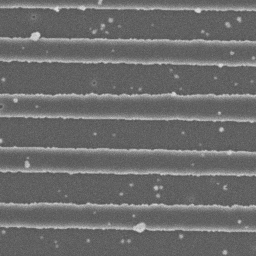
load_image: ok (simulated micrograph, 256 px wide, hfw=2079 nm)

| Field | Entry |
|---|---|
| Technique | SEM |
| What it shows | lines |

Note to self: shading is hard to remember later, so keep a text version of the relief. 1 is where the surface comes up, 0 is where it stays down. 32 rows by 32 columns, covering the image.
11111111111111111111111111111111
00000000000000000000000000000000
00000000000000000000000000000000
00000000000000000000000000000000
00001000000000000000000000000000
11111111111111111111111111111111
11111111111111111111111111111111
11111111111111111111111111111111
00000000000000000000000000000000
00000000000000000000000000000000
00000000000000000000000000000000
00000000000000000000000000000000
11111111111111111111111111111111
11111111111111111111111111111111
11111111111111111111111111111111
00000000000000000000000000000000
00000000000000000000000000000000
00000000000000000000000000000000
11111111000000000000000000000000
11111111111111111111111111111111
11111111111111111111111111111111
00000000111111111111111111111111
00000000000000000000000000000000
00000000000000000000000000000000
00000000000000000000000000000000
11001111100100000000000000000000
11111111111111111111111111111111
11111111111111111111111111111111
00001111111111111111111111111111
00000000000000000000000000000000
00000000000000000000000000000000
00000000000000000000000000000000